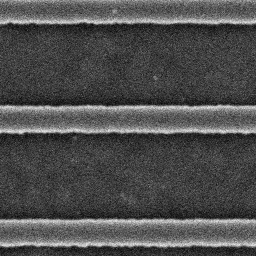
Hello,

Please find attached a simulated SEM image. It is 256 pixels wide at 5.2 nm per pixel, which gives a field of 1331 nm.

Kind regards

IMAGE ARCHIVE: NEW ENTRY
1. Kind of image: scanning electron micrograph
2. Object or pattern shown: lines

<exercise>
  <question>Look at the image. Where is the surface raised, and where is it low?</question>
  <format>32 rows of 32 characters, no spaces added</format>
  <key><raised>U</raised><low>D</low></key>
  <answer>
UUUUUUUUUUUUUUUUUUUUUUUUUUUUUUUU
UUUUUUUUUUUUUUUUUUUUUUUUUUUUUUUU
UUUUUUUUUUUUUUUUUUUUUUUUUUUUUUUU
DDDDDDDDDDDDDDDDDDDDDDDDDDDDDDDD
DDDDDDDDDDDDDDDDDDDDDDDDDDDDDDDD
DDDDDDDDDDDDDDDDDDDDDDDDDDDDDDDD
DDDDDDDDDDDDDDDDDDDDDDDDDDDDDDDD
DDDDDDDDDDDDDDDDDDDDDDDDDDDDDDDD
DDDDDDDDDDDDDDDDDDDDDDDDDDDDDDDD
DDDDDDDDDDDDDDDDDDDDDDDDDDDDDDDD
DDDDDDDDDDDDDDDDDDDDDDDDDDDDDDDD
DDDDDDDDDDDDDDDDDDDDDDDDDDDDDDDD
DDDDDDDDDDDDDDDDDDDDDDDDDDDDDDDD
UUUUUUUUUUUUUUUUUUUUUUUUUUUUUUUU
UUUUUUUUUUUUUUUUUUUUUUUUUUUUUUUU
UUUUUUUUUUUUUUUUUUUUUUUUUUUUUUUU
UUUUUUUUUDUUUUDUUUUUUUUDDUUUUUUU
DDDDDDDDDDDDDDDDDDDDDDDDDDDDDDDD
DDDDDDDDDDDDDDDDDDDDDDDDDDDDDDDD
DDDDDDDDDDDDDDDDDDDDDDDDDDDDDDDD
DDDDDDDDDDDDDDDDDDDDDDDDDDDDDDDD
DDDDDDDDDDDDDDDDDDDDDDDDDDDDDDDD
DDDDDDDDDDDDDDDDDDDDDDDDDDDDDDDD
DDDDDDDDDDDDDDDDDDDDDDDDDDDDDDDD
DDDDDDDDDDDDDDDDDDDDDDDDDDDDDDDD
DDDDDDDDDDDDDDDDDDDDDDDDDDDDDDDD
DDDDDDDDDDDDDDDDDDDDDDDDDDDDDDDD
DDDDDUDDDDUDDDUDDDDDUDDDUUDDDUDD
UUUUUUUUUUUUUUUUUUUUUUUUUUUUUUUU
UUUUUUUUUUUUUUUUUUUUUUUUUUUUUUUU
UUUUUUUUUUUUUUUUUUUUUUUUUUUUUUUU
DDDDDDDDDDDDDDDDDDDDDDDDDDDDDDDD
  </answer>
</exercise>